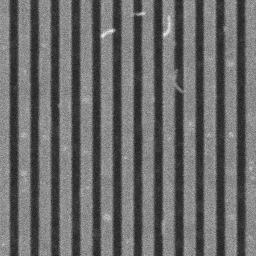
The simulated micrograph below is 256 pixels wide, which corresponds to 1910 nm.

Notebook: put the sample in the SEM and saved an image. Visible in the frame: parallel lines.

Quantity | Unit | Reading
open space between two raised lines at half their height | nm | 71.8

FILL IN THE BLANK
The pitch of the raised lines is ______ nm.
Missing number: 154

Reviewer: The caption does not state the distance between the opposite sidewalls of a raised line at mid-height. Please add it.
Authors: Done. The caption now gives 78.4 nanometres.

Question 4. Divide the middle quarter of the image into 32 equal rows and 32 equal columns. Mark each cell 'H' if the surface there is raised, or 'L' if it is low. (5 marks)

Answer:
HHLLHHHLLLHHLLLHHLLLHHLLLHHLLLHH
HHLLHHHLLLHHLLLHHLLLHHLLLHHLLLHH
HHLLHHHLLLHHLLLHHLLLHHLLLHHLLLHH
HHLLHHHLLLHHLLLHHLLLHHLLLHHLLLHH
HHLLHHHLLLHHLLLHHLLLHHLLLHHLLLHH
HHLLHHHLLLHHLLLHHLLLHHLLLHHLLLHH
HHLLHHHLLLHHLLLHHLLLHHLLLHHLLLHH
HHLLHHHLLLHHLLLHHLLLHHLLLHHLLLHH
HHLLHHHLLLHHLLLHHLLLHHLLLHHLLLHH
HHLLHHHLLLHHLLLHHLLLHHLLLHHLLLHH
HHLLHHHLLLHHLLLHHLLLHHLLLHHLLLHH
HHLLHHHLLLHHLLLHHLLLHHLLLHHLLLHH
HHLLHHHLLLHHLLLHHLLLHHLLLHHLLLHH
HHLLHHHLLLHHLLLHHLLLHHLLLHHLLLHH
HHLLHHHLLLHHLLLHHLLLHHLLLHHLLLHH
HHLLHHHLLLHHLLLHHLLLHHLLLHHLLLHH
HHLLHHHLLLHHLLLHHLLLHHLLLHHLLLHH
HHLLHHHLLLHHLLLHHLLLHHLLLHHLLLHH
HHLLHHHLLLHHLLLHHLLLHHLLLHHLLLHH
HHLLHHHLLLHHLLLHHLLLHHLLLHHLLLHH
HHLLHHHLLLHHLLLHHLLLHHLLLHHLLLHH
HHLLHHHLLLHHLLLHHLLLHHLLLHHLLLHH
HHLLHHHLLLHHLLLHHLLLHHLLLHHLLLHH
HHLLHHHLLLHHLLLHHLLLHHLLLHHLLLHH
HHLLHHHLLLHHLLLHHLLLHHLLLHHHLLHH
HHLLHHHLLLHHLLLHHLLLHHLLLHHHLLHH
HHLLHHHLLLHHLLLHHLLLHHLLLHHHLLHH
HHLLHHHLLLHHLLLHHLLLHHLLLHHHLLHH
HHLLHHHLLLHHLLLHHLLLHHLLLHHHLLHH
HHLLHHHLLLHHLLLHHLLLHHLLLHHHLLHH
HHLLHHHLLLHHLLLHHLLLHHLLLHHHLLHH
HHLLHHHLLLHHLLLHHLLLHHLLLHHHLLHH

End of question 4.